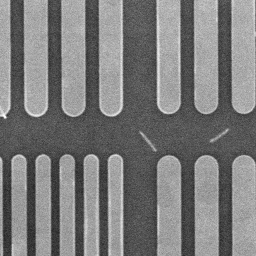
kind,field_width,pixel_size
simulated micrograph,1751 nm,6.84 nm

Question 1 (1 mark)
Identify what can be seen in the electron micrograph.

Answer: groups of lines, slits or small figures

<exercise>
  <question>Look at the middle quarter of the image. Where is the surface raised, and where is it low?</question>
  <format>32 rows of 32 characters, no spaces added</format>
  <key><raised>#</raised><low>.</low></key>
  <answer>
#####....#####..........#####...
#####....#####..........#####...
#####....#####..........#####...
#####....#####..........#####...
#####....#####..........#####...
#####....#####..........#####...
#####....#####..........#####...
#####....#####..........#####...
#####....#####..........#####...
#####....#####..........#####...
#####....#####..........#####...
#####....#####..........####....
.###......###...................
................................
................................
................................
................................
................................
................................
................................
................................
................................
................................
##...###...###...........###....
##...###...###..........#####...
##...###...###..........#####...
##...###...###..........#####...
##...###...###..........#####...
##...###...###..........#####...
##...###...###..........#####...
##...###...###..........#####...
##...###...###..........#####...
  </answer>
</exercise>